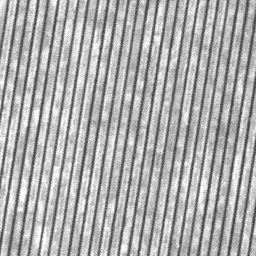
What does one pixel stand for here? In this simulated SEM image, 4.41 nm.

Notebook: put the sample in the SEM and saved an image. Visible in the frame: parallel lines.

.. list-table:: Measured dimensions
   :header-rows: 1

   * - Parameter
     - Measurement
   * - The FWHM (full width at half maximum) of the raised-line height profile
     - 28.9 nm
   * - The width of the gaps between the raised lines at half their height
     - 16.3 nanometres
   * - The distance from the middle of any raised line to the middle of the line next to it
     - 43.5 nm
